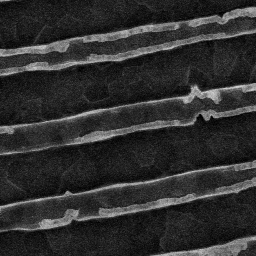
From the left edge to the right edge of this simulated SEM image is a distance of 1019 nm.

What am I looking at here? one or a few lines or trenches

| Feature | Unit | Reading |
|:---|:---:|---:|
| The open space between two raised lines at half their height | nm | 201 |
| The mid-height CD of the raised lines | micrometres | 0.102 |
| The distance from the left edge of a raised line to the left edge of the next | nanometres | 304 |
